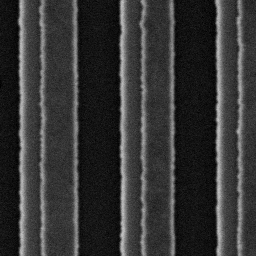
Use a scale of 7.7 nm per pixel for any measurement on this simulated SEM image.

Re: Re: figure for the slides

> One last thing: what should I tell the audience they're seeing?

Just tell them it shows lines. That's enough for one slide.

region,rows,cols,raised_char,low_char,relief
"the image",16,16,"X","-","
-XXXX---XXX---XX
-XXXX---XXX---XX
-XXXX---XXX---XX
-XXXX---XXX---XX
-XXXX---XXX---XX
-XXXX---XXX---XX
-XXXX---XXX---XX
-XXXX---XXX---XX
-XXXX---XXX---XX
-XXXX---XXX---XX
-XXXX---XXX---XX
-XXXX---XXX---XX
-XXXX---XXX---XX
-XXXX---XXX---XX
-XXXX---XXX---XX
-XXXX---XXX---XX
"